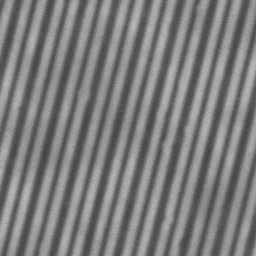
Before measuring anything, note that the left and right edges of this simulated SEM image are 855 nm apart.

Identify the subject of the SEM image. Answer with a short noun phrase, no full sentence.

parallel lines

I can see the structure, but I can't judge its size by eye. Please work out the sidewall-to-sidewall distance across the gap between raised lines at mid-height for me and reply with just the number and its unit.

22.9 nm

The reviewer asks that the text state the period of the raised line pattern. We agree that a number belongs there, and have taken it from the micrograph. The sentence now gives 52.6 nm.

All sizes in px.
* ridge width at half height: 7.63